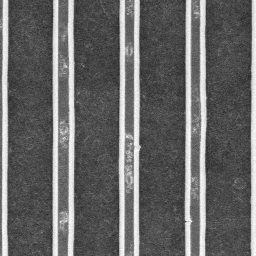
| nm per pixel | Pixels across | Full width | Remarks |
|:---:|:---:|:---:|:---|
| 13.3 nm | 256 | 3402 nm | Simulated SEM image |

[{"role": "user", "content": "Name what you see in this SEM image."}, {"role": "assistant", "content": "one or a few lines or trenches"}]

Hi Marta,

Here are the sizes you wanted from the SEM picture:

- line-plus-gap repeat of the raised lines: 876 nm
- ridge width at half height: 214 nanometers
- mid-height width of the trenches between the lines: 659 nanometres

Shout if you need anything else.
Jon